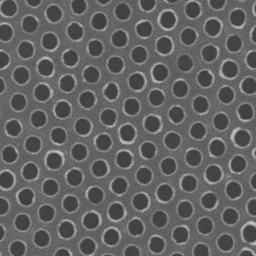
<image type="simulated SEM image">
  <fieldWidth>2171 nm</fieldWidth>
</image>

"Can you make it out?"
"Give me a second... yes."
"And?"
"a regular array of holes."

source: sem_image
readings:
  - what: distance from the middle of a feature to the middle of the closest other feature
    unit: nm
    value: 218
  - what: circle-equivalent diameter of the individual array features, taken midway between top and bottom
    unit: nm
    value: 138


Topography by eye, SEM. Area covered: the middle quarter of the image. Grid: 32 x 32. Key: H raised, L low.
HLHHHHHHHHHLLLLHHHHHHHHLLHHHLLLL
HHHHHLLLLHHLLLHHHHHHHHLLLLHHHLLH
HHHHHLLLLHHHHHHHHLLHHHLLLLHHHHHH
LLHHHLLLLHHHHHHHLLLLHHHLLLHHHHHH
LLLHHHLLHHHHHHHHLLLLHHHHHHHHLLHH
LLLHHHHHHHHLLHHHLLLLHHHHHHHLLLLH
LLHHHHHHHHLLLHHHHHHHHHHHHHHLLLLH
HHHHLLLHHHLLLLHHHHHHHLLLLHHLLLLH
HHHHLLLLHHHLLHHHHHHHHLLLLHHHHHHH
LHHHLLLLHHHHHHHLLLLHHHLLLHHHHHHH
LHHHLLLHHHHHHHHLLLLHHHHHHHHHHHHH
LLHHHHHHHHLLHHHLLLLHHHHHHHLLLLHH
LLHHHHHHHLLLLHHHLLHHHHHHHHLLLLHH
HHHHHHHHHLLLLHHHHHHHHLLHHHLLLLHH
HHHLLLHHHHLLLHHHHHHHLLLLHHHLLHHH
HHHLLLLHHHHHHHHLLHHHLLLLHHHHHHHH
HHHLLLLHHHHHHHLLLLHHHLLHHHHHHHHH
LHHHLLHHHHHHHHLLLLHHHHHHHHLLHHHH
LHHHHHHHLLLLHHLLLHHHHHHHHLLLLHHH
HHHHHHHHLLLLHHHHHHHHHHHHHLLLLHHH
HHLLLHHHLLLLHHHHHHHLLLLHHHLLLHHH
HHLLLLHHHLLHHHHHHHHLLLLHHHHHHHHH
HHLLLLHHHHHHHLLLHHHLLLLHHHHHHHHL
HHLLLHHHHHHHHLLLLHHHHLHHHHLHHHLL
HHHHHHHHLLHHHLLLLHHHHHHHLLLLHHHL
HHHHHHHLLLLHHHLLHHHHHHHHLLLLHHHH
HHLHHHHLLLLHHHHHHHHLLHHHLLLLHHHH
HLLLHHHLLLHHHHHHHHLLLLHHHLLHHHHH
HLLLLHHHHHHHHLLHHHLLLLHHHHHHHHLL
HLLLHHHHHHHHLLLLHHHLLHHHHHHHHLLL
HHLHHHHHHHHHLLLLHHHHHHHHLLHHHLLL
HHHHHHLLLHHHLLLLHHHHHHHLLLLHHHLL